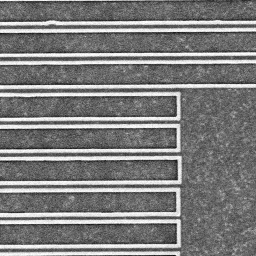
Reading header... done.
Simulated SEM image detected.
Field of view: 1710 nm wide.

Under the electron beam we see parallel lines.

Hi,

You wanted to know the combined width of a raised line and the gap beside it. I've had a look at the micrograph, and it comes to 213 nm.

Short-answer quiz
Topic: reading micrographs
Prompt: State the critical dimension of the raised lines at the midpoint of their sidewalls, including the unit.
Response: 0.0551 um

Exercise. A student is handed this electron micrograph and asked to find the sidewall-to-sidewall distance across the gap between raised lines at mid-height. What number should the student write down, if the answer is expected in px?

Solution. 23.9